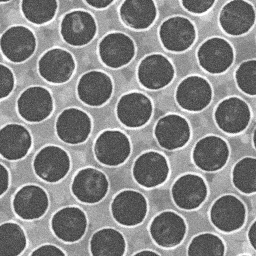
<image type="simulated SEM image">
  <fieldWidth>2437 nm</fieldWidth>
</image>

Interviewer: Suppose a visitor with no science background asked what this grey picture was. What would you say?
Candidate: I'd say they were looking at a regular array of holes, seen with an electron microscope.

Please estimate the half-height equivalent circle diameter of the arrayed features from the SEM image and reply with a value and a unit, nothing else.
349 nm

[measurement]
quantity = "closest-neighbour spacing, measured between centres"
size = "415 nanometres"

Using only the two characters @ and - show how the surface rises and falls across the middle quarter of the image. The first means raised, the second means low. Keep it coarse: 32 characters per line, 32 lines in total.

---@@@@@@@@----@@@@--------@@@@@
---@@@@@@@@@@@@@@@----------@@@@
--@@@------@@@@@@@----------@@@@
--@@--------@@@@@@---------@@@--
@@@@--------@@@@@@@--------@@---
@@@---------@@@@@@@@------@@----
@@@---------@@@@@@@@@@-@@@@@----
@@@---------@@@-----@@@@@@@@----
@@@@--------@@-------@@@@@@@----
@@@@@------@@---------@@@@@@----
@@@@@@---@@@@---------@@@@@@@---
----@@@@@@@@@---------@@@@@@@@--
------@@@@@@@---------@@@@@-@@@@
-------@@@@@@---------@@------@@
-------@@@@@@@-------@@--------@
-------@@@@@@@@-----@@@--------@
-------@@@@@@@@@@@@@@@@---------
-------@@------@@@@@@@@---------
------@@--------@@@@@@@---------
-----@@@--------@@@@@@@--------@
@@@@@@@----------@@@@@@@------@@
@@@@@@@----------@@@@@@@@@--@@@@
-@@@@@@@---------@@@----@@@@@@@@
-@@@@@@@--------@@-------@@@@@@@
--@@@@@@@------@@@--------@@@@@@
--@@@@@@@@@--@@@@---------@@@@@@
-@@@----@@@@@@@@@---------@@@@@@
-@@-------@@@@@@@---------@@@@--
@@---------@@@@@@---------@@@---
@@---------@@@@@@@-------@@@----
@@---------@@@@@@@@----@@@@-----
@@---------@@@@--@@@@@@@@@@-----